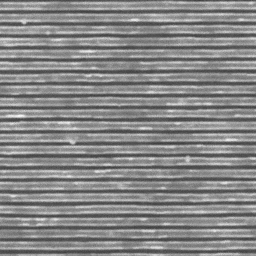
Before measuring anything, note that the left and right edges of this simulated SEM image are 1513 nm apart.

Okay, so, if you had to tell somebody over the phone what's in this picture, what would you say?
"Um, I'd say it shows parallel lines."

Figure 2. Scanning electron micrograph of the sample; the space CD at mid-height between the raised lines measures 28.8 nm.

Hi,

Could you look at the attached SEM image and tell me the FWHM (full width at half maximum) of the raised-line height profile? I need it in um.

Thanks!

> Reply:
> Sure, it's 0.0406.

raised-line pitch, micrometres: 0.0709